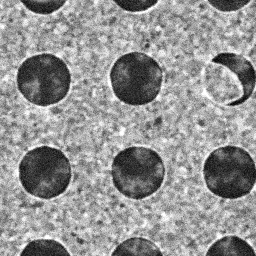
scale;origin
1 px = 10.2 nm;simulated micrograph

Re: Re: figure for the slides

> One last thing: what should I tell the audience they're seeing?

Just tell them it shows holes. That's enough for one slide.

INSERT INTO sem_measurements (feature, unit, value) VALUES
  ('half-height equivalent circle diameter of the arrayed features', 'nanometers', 554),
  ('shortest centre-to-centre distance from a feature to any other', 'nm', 938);